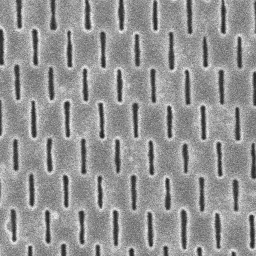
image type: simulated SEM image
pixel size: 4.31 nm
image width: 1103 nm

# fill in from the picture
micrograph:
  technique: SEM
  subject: a regular array of holes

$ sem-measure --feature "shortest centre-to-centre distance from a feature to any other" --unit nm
146